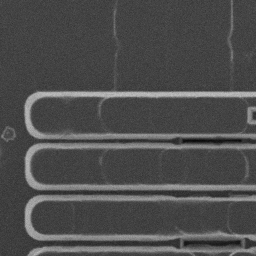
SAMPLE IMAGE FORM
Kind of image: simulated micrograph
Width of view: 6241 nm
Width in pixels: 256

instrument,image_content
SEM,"wiring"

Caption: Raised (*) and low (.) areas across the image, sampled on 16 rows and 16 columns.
................
................
................
................
................
................
..**************
..**************
....************
..**************
..**************
..**************
..**************
..**************
..**************
................